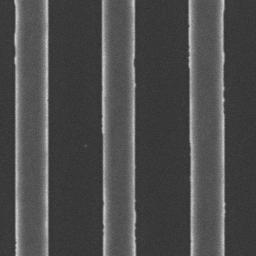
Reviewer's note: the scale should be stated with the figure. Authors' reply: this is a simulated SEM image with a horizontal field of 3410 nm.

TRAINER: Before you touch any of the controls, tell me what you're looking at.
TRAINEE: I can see lines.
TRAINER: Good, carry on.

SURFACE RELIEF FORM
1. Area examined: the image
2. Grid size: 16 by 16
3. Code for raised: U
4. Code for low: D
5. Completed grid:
DUUDDDUUDDDDUUDD
DUUDDDUUDDDDUUDD
DUUDDDUUDDDDUUDD
DUUDDDUUDDDDUUDD
DUUDDDUUDDDDUUDD
DUUDDDUUDDDDUUDD
DUUDDDUUDDDDUUDD
DUUDDDUUDDDDUUDD
DUUDDDUUDDDDUUDD
DUUDDDUUDDDDUUDD
DUUDDDUUDDDDUUDD
DUUDDDUUDDDDUUDD
DUUDDDUUDDDDUUDD
DUUDDDUUDDDDUUDD
DUUDDDUUDDDDUUDD
DUUDDDUUDDDDUUDD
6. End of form